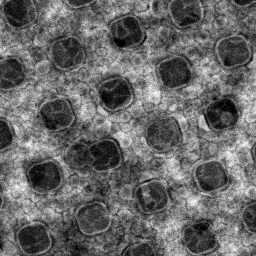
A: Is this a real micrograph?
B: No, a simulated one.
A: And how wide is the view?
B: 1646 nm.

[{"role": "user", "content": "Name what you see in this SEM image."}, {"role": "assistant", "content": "a regular array of raised bodies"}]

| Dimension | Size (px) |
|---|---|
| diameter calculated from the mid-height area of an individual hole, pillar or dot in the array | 33.1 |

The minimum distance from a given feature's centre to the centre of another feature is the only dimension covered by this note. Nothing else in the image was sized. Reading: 0.401 um